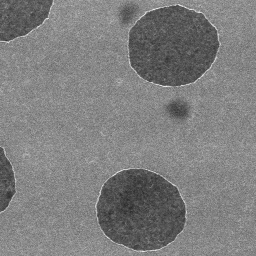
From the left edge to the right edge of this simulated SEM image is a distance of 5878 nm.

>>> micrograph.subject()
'raised bodies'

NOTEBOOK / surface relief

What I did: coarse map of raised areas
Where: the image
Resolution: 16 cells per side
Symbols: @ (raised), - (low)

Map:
@@@-------@@----
@@@-----@@@@@---
@-------@@@@@@--
--------@@@@@@--
--------@@@@@---
----------------
----------------
----------------
----------------
----------------
@---------------
@------@@@@-----
@-----@@@@@-----
------@@@@@@----
------@@@@@-----
--------@@------